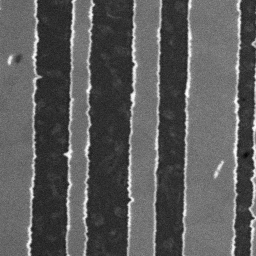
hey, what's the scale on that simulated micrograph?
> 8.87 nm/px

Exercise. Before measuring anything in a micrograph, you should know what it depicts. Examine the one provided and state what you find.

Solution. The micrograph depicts one or a few lines or trenches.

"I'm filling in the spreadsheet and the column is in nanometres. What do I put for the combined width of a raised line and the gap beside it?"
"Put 588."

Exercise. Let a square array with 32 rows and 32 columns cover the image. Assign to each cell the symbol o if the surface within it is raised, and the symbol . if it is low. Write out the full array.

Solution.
ooooo....ooo.....ooo....oooooo..
oooo.....oo......ooo....oooooo..
ooooo....oo......ooo....oooooo..
ooooo....oo......ooo....oooooo..
ooooo....oo......ooo....oooooo..
ooooo....oo......ooo....oooooo..
ooooo....oo......ooo....oooooo..
oooo.....oo......ooo....oooooo..
oooo.....oo......ooo....oooooo..
ooooo....oo......ooo....oooooo..
oooo.....oo......ooo...ooooooo..
oooo.....oo......ooo...ooooooo..
oooo.....oo.....oooo...ooooooo..
oooo.....oo.....oooo...ooooooo..
oooo.....oo.....oooo...ooooooo..
oooo.....oo.....oooo...ooooooo..
oooo.....oo.....oooo...ooooooo..
oooo.....oo.....oooo...ooooooo..
oooo.....oo.....oooo...ooooooo..
oooo....ooo.....oooo...ooooooo..
oooo.....oo.....oooo...ooooooo..
oooo.....oo.....ooo....oooooo...
oooo.....oo.....ooo....ooooooo..
oooo.....oo.....ooo....oooooo...
oooo....ooo.....ooo....oooooo...
oooo....ooo.....ooo....oooooo...
oooo....ooo.....ooo....oooooo..o
oooo....ooo.....ooo....oooooo...
oooo....ooo.....ooo....oooooo..o
oooo....ooo.....ooo....oooooo..o
oooo....ooo.....ooo....oooooo..o
oooo....ooo.....ooo....oooooo..o